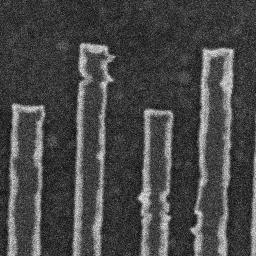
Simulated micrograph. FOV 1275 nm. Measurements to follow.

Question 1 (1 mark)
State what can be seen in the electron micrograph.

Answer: one or a few lines or trenches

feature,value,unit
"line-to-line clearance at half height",176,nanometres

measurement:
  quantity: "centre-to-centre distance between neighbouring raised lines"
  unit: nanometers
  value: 311